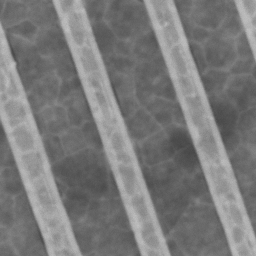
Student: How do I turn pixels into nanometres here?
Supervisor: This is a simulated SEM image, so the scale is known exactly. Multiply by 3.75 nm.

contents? one or a few lines or trenches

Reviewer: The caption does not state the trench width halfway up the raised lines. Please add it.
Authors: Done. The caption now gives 242 nm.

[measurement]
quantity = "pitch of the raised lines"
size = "324 nm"